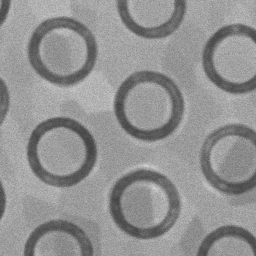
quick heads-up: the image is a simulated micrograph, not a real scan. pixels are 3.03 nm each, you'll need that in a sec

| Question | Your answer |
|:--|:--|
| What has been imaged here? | ring-shaped grooves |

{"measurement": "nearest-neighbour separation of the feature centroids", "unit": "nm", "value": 300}